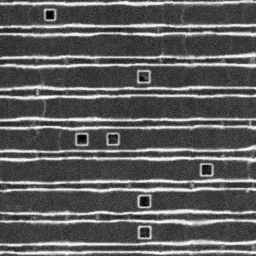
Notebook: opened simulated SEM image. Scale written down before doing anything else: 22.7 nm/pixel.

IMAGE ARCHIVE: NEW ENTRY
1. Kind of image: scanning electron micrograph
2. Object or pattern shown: wiring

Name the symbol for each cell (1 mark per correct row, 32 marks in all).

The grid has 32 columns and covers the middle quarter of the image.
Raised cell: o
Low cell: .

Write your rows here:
.ooooooooooooooooooooooooooooooo
oooooooooooooooooooooooooooooooo
oooooooooooooooooo....oooooooooo
oooooooooooooooooo....oooooooooo
ooooooooooooooooooo..ooooooooooo
oooooooooooooooooooooooooooooooo
................................
................................
oooooooooooooooooooooooooooooooo
oooooooooooooooooooooooooooooooo
oooooooooooooooooooooooooooooooo
oooooooooooooooooooooooooooooooo
oooooooooooooooooooooooooooooooo
oooooooooooooooooooooooooooooooo
................................
................................
oooooooooooooooooooooooooooooooo
oooo.oooooo..ooooooooooooooooooo
ooo...ooooo...oooooooooooooooooo
ooo...ooooo...oooooooooooooooooo
oooooooooooooooooooooooooooooooo
oooooooooooooooooooo............
................................
................................
oooooooooooooooooooooooooooooooo
oooooooooooooooooooooooooooooooo
oooooooooooooooooooooooooooooooo
oooooooooooooooooooooooooooooooo
oooooooooooooooooooooooooooooooo
ooooo...........................
................................
o...........oooo................